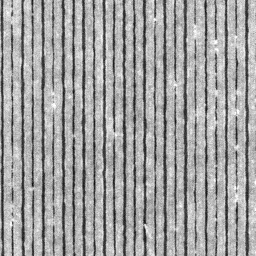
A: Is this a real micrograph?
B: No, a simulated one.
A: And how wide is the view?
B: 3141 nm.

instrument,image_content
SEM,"parallel lines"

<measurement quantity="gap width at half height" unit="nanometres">32.2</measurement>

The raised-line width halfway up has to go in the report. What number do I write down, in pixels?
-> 7.12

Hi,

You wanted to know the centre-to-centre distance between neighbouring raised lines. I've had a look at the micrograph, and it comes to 10.2 pixels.